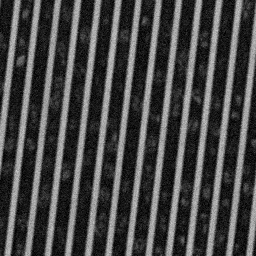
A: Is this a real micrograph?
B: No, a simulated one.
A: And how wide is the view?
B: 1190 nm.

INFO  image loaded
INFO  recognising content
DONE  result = parallel lines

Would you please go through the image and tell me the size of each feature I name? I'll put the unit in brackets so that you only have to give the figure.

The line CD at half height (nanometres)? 27.1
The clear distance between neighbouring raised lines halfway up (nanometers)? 68.1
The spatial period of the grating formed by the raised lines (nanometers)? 93.1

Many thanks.